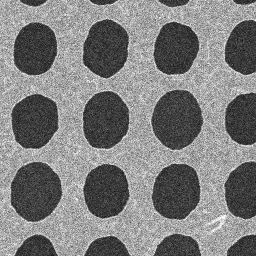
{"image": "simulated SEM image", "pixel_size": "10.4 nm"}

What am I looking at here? a regular array of holes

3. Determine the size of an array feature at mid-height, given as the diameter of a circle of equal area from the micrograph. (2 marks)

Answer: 538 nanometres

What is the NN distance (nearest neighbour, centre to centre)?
0.734 microns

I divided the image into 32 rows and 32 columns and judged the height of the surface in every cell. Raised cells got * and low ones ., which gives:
***..*******..******...*******.*
********************************
*************.******************
***...*****....*****....*****...
**.....****.....****.....****...
**.....***......***......***....
**.....***......***......***....
**.....***......***.....****....
**....*****....*****....*****...
************..******************
********************************
*************.*******...********
***....****....*****.....****...
**.....****.....***......***....
*......***......***......***....
*......***......***......***....
**.....***......***......***....
**....*****....*****....*****...
***..*******.********..*********
********************************
****..****************.*******..
**.....****....*****....*****...
**......***.....***......***....
*.......**......***......***....
*.......***.....***......***....
*......****.....***......***....
**.....****....*****....*****...
***..***************************
********************************
****.****************...*******.
***....****....*****.....****...
**.....****.....***......***....